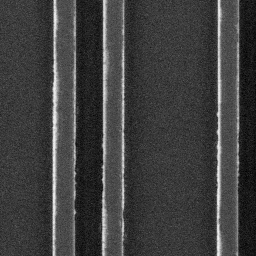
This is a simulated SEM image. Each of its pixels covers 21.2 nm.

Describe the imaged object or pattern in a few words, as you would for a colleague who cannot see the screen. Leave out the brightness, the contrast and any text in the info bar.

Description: lines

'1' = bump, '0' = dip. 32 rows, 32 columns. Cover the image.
00000001100001100000000000011100
00000001100001100000000000011100
00000001100001100000000000011100
00000001100001100000000000011100
00000001100001100000000000011100
00000001100001100000000000011100
00000001100001100000000000011100
00000001100001100000000000011100
00000001100001100000000000011100
00000001100001100000000000011100
00000001100001100000000000011100
00000001100001100000000000011100
00000001100001100000000000011100
00000001100001100000000000011100
00000001100001100000000000011100
00000001100001100000000000011100
00000001100001100000000000011100
00000001100001100000000000011100
00000001100001100000000000011100
00000001100001100000000000011100
00000001100001100000000000011100
00000001100001100000000000011100
00000001100001100000000000011100
00000001100001100000000000011100
00000001100001100000000000011100
00000001100001100000000000011100
00000001100001100000000000011100
00000001100001100000000000011100
00000001100001100000000000011100
00000001100001100000000000011100
00000001100001100000000000011100
00000001100001100000000000011100